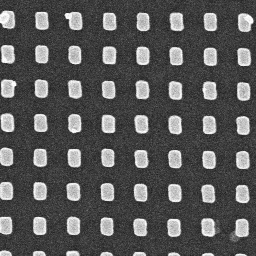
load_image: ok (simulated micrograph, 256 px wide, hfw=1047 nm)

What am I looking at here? a regular array of raised bodies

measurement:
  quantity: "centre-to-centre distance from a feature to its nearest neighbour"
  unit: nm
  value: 136